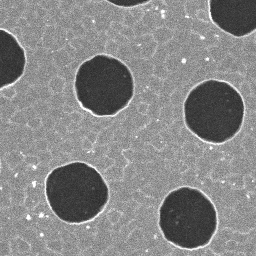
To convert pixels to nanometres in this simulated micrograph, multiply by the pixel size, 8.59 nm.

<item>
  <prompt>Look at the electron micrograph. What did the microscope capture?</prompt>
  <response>holes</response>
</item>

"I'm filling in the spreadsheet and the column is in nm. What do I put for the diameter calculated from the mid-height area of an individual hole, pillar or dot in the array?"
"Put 514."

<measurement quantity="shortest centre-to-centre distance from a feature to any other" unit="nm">948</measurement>